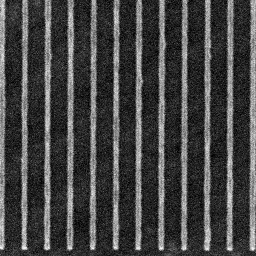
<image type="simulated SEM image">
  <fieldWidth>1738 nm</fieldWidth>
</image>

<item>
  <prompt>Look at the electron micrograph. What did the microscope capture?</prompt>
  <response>parallel lines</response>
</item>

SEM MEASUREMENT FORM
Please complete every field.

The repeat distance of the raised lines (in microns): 0.155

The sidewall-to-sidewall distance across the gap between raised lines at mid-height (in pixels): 18.6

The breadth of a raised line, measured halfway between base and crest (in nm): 26.3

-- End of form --